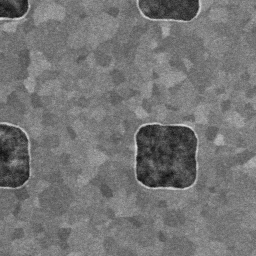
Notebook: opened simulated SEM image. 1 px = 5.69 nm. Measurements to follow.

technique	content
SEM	holes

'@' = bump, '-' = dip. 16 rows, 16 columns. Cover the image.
--@@@@@@@---@@@@
@@@@@@@@@@@@@@@@
@@@@@@@@@@@@@@@@
@@@@@@@@@@@@@@@@
@@@@@@@@@@@@@@@@
@@@@@@@@@@@@@@@@
@@@@@@@@@@@@@@@@
@@@@@@@@@@@@@@@@
--@@@@@@@---@@@@
--@@@@@@@---@@@@
--@@@@@@----@@@@
-@@@@@@@@---@@@@
@@@@@@@@@@@@@@@@
@@@@@@@@@@@@@@@@
@@@@@@@@@@@@@@@@
@@@@@@@@@@@@@@@@